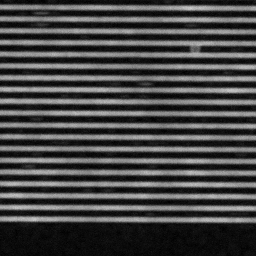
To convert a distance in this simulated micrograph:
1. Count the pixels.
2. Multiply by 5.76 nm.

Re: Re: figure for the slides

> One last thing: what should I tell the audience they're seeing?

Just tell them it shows parallel lines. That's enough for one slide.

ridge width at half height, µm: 0.0252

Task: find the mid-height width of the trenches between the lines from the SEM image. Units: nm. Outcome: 40.3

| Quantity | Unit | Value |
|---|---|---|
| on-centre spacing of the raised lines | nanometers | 67.8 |